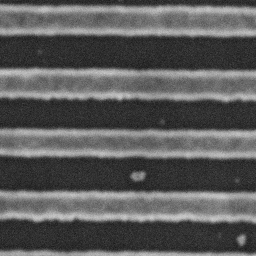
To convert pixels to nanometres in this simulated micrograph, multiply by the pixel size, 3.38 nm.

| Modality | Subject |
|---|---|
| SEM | lines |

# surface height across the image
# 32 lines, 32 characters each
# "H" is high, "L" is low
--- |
LLLLLLLLLLLLLLLLLLLLLLLLLLLLLLLL
HHHHHHHHHHHHHHHHHHHHHHHHHHHHHHHH
HHHHHHHHHHHHHHHHHHHHHHHHHHHHHHHH
HHHHHHHHHHHHHHHHHHHHHHHHHHHHHHHH
LLLLLLLLLLLLLLLLLLLLLLLLLLLLLLLL
LLLLLLLLLLLLLLLLLLLLLLLLLLLLLLLL
LLLLLLLLLLLLLLLLLLLLLLLLLLLLLLLL
LLLLLLLLLLLLLLLLLLLLLLLLLLLLLLLL
LLLLLLLLLLLLLLLLLLLLLLLLLLLLLLLL
HHHHHHHHHHHHHHHHHHHHHHHHHHHHHHHH
HHHHHHHHHHHHHHHHHHHHHHHHHHHHHHHH
HHHHHHHHHHHHHHHHHHHHHHHHHHHHHHHH
LLLLLLLLLLLLLLLLLLLLLLLLLLLLLLLL
LLLLLLLLLLLLLLLLLLLLLLLLLLLLLLLL
LLLLLLLLLLLLLLLLLLLLLLLLLLLLLLLL
LLLLLLLLLLLLLLLLLLLLLLLLLLLLLLLL
HHHHHHHHHHHHHHHLLLHHLLLLLLLLLLLL
HHHHHHHHHHHHHHHHHHHHHHHHHHHHHHHH
HHHHHHHHHHHHHHHHHHHHHHHHHHHHHHHH
LLLLLLLLLLLLLLLLLLLLLLLLLLLHHLLH
LLLLLLLLLLLLLLLLLLLLLLLLLLLLLLLL
LLLLLLLLLLLLLLLLLLLLLLLLLLLLLLLL
LLLLLLLLLLLLLLLLLLLLLLLLLLLLLLLL
LLLLLLLLLLLLLLLLLLLLLLLLLLLLLLLL
HHHHHHHHHHHHHHHHHHHHHHHHHHHHHHHH
HHHHHHHHHHHHHHHHHHHHHHHHHHHHHHHH
HHHHHHHHHHHHHHHHHHHHHHHHHHHHHHHH
LLLLLLLLLLLLLLLLLLLLLLLLLHHLHHLH
LLLLLLLLLLLLLLLLLLLLLLLLLLLLLLLL
LLLLLLLLLLLLLLLLLLLLLLLLLLLLLLLL
LLLLLLLLLLLLLLLLLLLLLLLLLLLLLLLL
LLLLLLLLLLLLLLLLLLLLLLLLLLLLLLLL